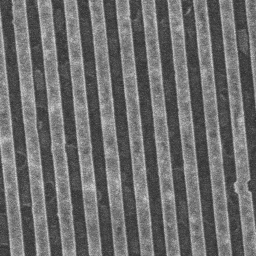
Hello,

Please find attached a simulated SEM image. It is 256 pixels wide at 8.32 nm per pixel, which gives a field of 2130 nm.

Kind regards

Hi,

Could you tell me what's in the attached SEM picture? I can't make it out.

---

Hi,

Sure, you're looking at parallel lines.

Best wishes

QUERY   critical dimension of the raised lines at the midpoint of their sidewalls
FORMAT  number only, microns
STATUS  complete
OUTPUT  0.105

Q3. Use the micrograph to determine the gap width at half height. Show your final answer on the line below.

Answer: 112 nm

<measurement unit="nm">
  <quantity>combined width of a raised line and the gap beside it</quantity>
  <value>215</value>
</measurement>